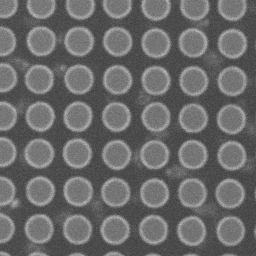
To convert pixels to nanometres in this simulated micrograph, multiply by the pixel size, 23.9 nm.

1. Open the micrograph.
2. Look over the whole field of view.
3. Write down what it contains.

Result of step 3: a regular array of raised bodies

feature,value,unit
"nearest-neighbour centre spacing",891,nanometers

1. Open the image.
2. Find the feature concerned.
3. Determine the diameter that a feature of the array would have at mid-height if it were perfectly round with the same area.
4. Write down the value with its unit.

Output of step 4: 645 nanometers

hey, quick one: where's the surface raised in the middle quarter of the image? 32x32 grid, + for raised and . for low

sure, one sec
................................
.+++++.....++++......++++.....++
.++++++...++++++....++++++....++
.++++++...+++++++...++++++...+++
.++++++...+++++++...++++++...+++
.++++++...++++++....++++++...+++
..++++.....+++++.....++++.....++
...............................+
................................
................................
..++++.....++++......++++......+
.+++++....++++++....++++++....++
+++++++...++++++....++++++...+++
+++++++...++++++....++++++...+++
++++++....++++++....++++++...+++
.+++++.....+++++.....++++.....++
..++..................++.......+
................................
................................
.++++.......+++.......+........+
.+++++.....+++++....+++++.....++
++++++....++++++....++++++...+++
+++++++...++++++....++++++...+++
++++++....++++++....++++++...+++
.+++++....++++++....+++++....+++
..+++......++++......+++......++
................................
................................
................................
.+++++.....++++......+++......++
+++++++...++++++....+++++....+++
+++++++...++++++...+++++++...+++